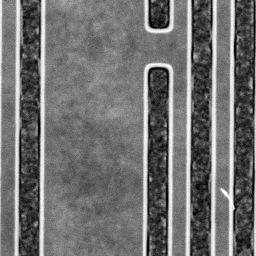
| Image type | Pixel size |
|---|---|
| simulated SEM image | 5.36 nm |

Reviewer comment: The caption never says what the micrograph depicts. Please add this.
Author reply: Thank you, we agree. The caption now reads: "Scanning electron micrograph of groups of lines, slits or small figures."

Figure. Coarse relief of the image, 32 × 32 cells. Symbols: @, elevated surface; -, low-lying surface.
@@---@@@@@@@@@@@@@---@@@---@@---
@@---@@@@@@@@@@@@@---@@@---@@---
@@---@@@@@@@@@@@@@---@@@---@@---
@@---@@@@@@@@@@@@@@--@@@---@@---
@@---@@@@@@@@@@@@@@@@@@@---@@---
@@---@@@@@@@@@@@@@@@@@@@---@@---
@@---@@@@@@@@@@@@@@@@@@@---@@---
@@---@@@@@@@@@@@@@@@@@@@---@@---
@@---@@@@@@@@@@@@@@--@@@---@@---
@@---@@@@@@@@@@@@@---@@@---@@---
@@---@@@@@@@@@@@@@---@@@---@@---
@@---@@@@@@@@@@@@@---@@@---@@---
@@---@@@@@@@@@@@@@---@@@---@@---
@@---@@@@@@@@@@@@@---@@@---@@---
@@---@@@@@@@@@@@@@---@@@---@@---
@@---@@@@@@@@@@@@@---@@@---@@---
@@---@@@@@@@@@@@@@---@@@---@@---
@@---@@@@@@@@@@@@@---@@@---@@---
@@---@@@@@@@@@@@@@---@@@---@@---
@@---@@@@@@@@@@@@@---@@@---@@---
@@---@@@@@@@@@@@@@---@@@---@@---
@@---@@@@@@@@@@@@@---@@@---@@---
@@---@@@@@@@@@@@@@---@@@---@@---
@@---@@@@@@@@@@@@@---@@@---@@---
@@---@@@@@@@@@@@@@---@@@---@@---
@@---@@@@@@@@@@@@@---@@@---@@---
@@---@@@@@@@@@@@@@---@@@---@@---
@@---@@@@@@@@@@@@@---@@@---@@---
@@---@@@@@@@@@@@@@---@@@---@@---
@@---@@@@@@@@@@@@@---@@@---@@---
@@---@@@@@@@@@@@@@---@@@---@@---
@@---@@@@@@@@@@@@@---@@@---@@---